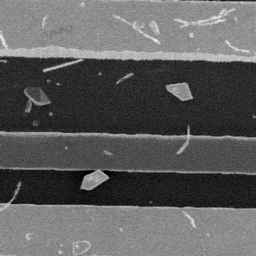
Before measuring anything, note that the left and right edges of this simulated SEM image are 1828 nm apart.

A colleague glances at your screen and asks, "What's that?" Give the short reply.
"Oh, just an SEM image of lines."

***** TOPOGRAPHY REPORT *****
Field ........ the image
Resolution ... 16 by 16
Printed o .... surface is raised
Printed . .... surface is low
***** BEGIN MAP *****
oooooooooooooooo
oooooooooooooooo
oooooooooooooooo
..........oooooo
................
................
................
................
oooooooooooo....
oooooooooooooooo
oooooooooooooooo
.....o..........
................
oooooooooooooooo
oooooooooooooooo
oooooooooooooooo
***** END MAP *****